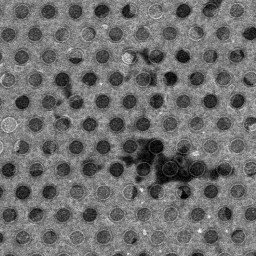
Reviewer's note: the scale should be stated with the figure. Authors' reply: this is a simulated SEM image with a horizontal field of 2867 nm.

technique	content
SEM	a regular array of raised bodies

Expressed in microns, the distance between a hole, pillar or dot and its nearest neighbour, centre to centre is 0.291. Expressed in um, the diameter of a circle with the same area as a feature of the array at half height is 0.169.